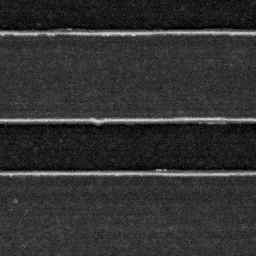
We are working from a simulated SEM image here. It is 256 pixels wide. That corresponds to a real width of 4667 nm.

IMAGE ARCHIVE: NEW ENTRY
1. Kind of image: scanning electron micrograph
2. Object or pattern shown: one or a few lines or trenches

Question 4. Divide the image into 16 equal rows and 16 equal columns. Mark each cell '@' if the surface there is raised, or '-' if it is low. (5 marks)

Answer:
----------------
----------------
@@@@@@@@@@@@@@@@
@@@@@@@@@@@@@@@@
@@@@@@@@@@@@@@@@
@@@@@@@@@@@@@@@@
@@@@@@@@@@@@@@@@
@@--@@@@@@@-----
----------------
----------------
----------------
@@@@@@@@@@@@@@@@
@@@@@@@@@@@@@@@@
@@@@@@@@@@@@@@@@
@@@@@@@@@@@@@@@@
@@@@@@@@@@@@@@@@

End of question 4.